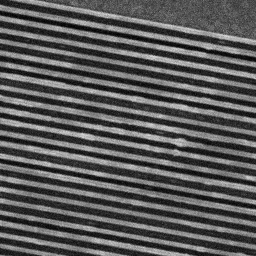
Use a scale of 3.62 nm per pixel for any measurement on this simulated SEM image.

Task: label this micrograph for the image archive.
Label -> parallel lines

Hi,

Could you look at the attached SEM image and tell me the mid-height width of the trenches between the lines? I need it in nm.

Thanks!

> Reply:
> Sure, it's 24.5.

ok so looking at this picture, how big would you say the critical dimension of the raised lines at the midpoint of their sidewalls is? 18.2 nanometres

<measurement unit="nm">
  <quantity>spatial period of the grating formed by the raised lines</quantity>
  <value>40.4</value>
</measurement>